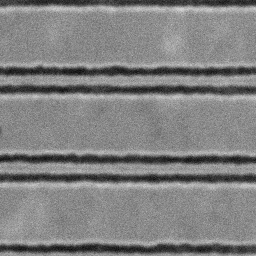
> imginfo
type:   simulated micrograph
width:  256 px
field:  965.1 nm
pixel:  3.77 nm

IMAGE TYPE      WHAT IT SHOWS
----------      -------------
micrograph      lines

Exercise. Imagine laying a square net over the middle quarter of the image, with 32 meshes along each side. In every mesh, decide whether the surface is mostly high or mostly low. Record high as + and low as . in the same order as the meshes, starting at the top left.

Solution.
++++++++++++...+++++++++..+++.++
................................
................................
++++++++++++++++++++++++++++++++
++++++++++++++++++++++++++++++++
................................
................................
..+++.......................++..
++++++++++++++++++++++++++++++++
++++++++++++++++++++++++++++++++
++++++++++++++++++++++++++++++++
++++++++++++++++++++++++++++++++
++++++++++++++++++++++++++++++++
++++++++++++++++++++++++++++++++
++++++++++++++++++++++++++++++++
++++++++++++++++++++++++++++++++
++++++++++++++++++++++++++++++++
++++++++++++++++++++++++++++++++
++++++++++++++++++++++++++++++++
++++++++++++++++++++++++++++++++
++++++++++++++++++++++++++++++++
++++++++++++++++++++++++++++++++
+..++....+..++++...+++++++++++++
................................
................................
++++++++++++++++++++++++++++++++
++++++++++++++++++++++++++++++++
..............+++++++..+++++.++.
................................
....+++.........................
++++++++++++++++++++++++++++++++
++++++++++++++++++++++++++++++++